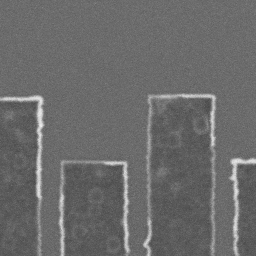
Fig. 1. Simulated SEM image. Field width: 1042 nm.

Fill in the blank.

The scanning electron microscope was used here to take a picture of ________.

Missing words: one or a few lines or trenches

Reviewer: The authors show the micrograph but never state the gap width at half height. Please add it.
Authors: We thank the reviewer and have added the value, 0.0839 um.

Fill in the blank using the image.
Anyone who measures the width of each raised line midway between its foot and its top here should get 252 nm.